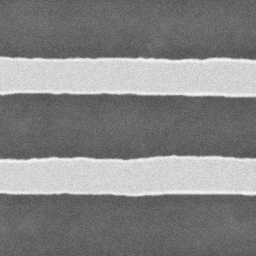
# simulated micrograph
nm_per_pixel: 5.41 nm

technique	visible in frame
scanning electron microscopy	lines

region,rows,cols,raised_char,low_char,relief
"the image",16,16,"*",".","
................
................
................
................
****************
****************
................
................
................
................
****************
****************
................
................
................
................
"